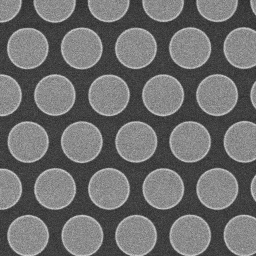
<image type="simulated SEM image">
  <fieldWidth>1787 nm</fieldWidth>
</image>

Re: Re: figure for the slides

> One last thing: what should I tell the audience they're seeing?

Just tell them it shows an array of small figures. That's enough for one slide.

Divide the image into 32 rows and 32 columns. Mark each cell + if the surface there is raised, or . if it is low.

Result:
+++.+++++..+++++..+++++..+++++.+
++...++++..+++++..+++++..++++...
+.....++.....++.....+.....++....
................................
.++++...++++...++++...++++..++++
.+++++..+++++..++++..+++++..++++
.+++++..+++++..++++..+++++..++++
.+++++..++++...++++...++++..++++
...+.....++.....++.....+......+.
+.....++.....+......+.....++....
++...++++...++++..+++++..++++...
+++.+++++..+++++..+++++..+++++.+
+++.+++++..+++++..+++++..+++++.+
++...++++...++++..++++...++++...
................................
..+++....++.....++.....++....+++
.+++++..++++...++++...++++..++++
.+++++..+++++..+++++.+++++..++++
.+++++..+++++..++++..+++++..++++
..+++...++++...++++...++++...+++
................................
++...+++....+++....+++....+++...
++...++++..+++++..+++++..++++...
+++.+++++..+++++..+++++..+++++.+
+++.+++++..+++++..+++++..+++++..
++...++++...+++....+++...++++...
................................
..+++....+++...++++...+++....+++
.+++++..+++++..++++..+++++..++++
.+++++..+++++.++++++.+++++..++++
.+++++..+++++..++++..+++++..++++
..+++....+++...++++...+++....+++